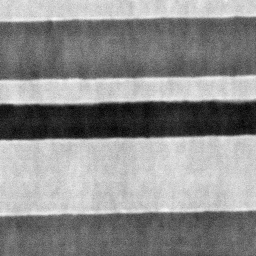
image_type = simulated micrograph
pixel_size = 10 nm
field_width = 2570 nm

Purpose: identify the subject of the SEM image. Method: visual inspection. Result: lines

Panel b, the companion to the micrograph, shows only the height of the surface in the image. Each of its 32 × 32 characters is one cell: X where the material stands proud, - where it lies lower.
XXXXXXXXXXXXXXXXXXXXXXXXXXXXXXXX
XXXXXXXXXXXXXXXXXXXXXXXXXXXXXXXX
XXXX----------------------------
--------------------------------
--------------------------------
--------------------------------
--------------------------------
--------------------------------
--------------------------------
--------------------------------
XXXXXXXXXXXXXXXXXXXXXXXXXXXXXXXX
XXXXXXXXXXXXXXXXXXXXXXXXXXXXXXXX
XXXXXXXXXXXXXXXXX---------------
--------------------------------
--------------------------------
--------------------------------
--------------------------------
-----XXXXXXXXXXXXXXXXXXXXXXXXXXX
XXXXXXXXXXXXXXXXXXXXXXXXXXXXXXXX
XXXXXXXXXXXXXXXXXXXXXXXXXXXXXXXX
XXXXXXXXXXXXXXXXXXXXXXXXXXXXXXXX
XXXXXXXXXXXXXXXXXXXXXXXXXXXXXXXX
XXXXXXXXXXXXXXXXXXXXXXXXXXXXXXXX
XXXXXXXXXXXXXXXXXXXXXXXXXXXXXXXX
XXXXXXXXXXXXXXXXXXXXXXXXXXXXXXXX
XXXXXXXXXXXXXXXXXXXXXXXXXXXXXXXX
XXXXXXXXXXXXXXXXXX--------------
--------------------------------
--------------------------------
--------------------------------
--------------------------------
--------------------------------